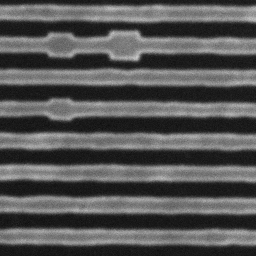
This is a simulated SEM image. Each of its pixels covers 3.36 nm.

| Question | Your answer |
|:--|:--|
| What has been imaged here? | wiring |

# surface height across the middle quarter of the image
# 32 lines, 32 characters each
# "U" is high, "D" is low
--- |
DDDDDDDDDDDDDDDDDDDDDDDDDDDDDDDD
DDDDDDDDDDDDDDDDDDDDDDDDDDDDDDDD
UUUUUUUUUUUUUUUUUUUUUUUUUUUUUUUU
UUUUUUUUUUUUUUUUUUUUUUUUUUUUUUUU
UUUUUUUUUUUUUUUUUUUUUUUUUUUUUUUU
DDDDDDDDDDDDDDDDDDDDDDDDDDDDDDDD
DDDDDDDDDDDDDDDDDDDDDDDDDDDDDDDD
DDDDDDDDDDDDDDDDDDDDDDDDDDDDDDDD
DDDDDDDDDDDDDDDDDDDDDDDDDDDDDDDD
UUDDDDDDDDDDDDDDDDDDDDDDDDDDDDDD
UUUUUUUUUUUUUUUUUUUUUUUUUUUUUUUU
UUUUUUUUUUUUUUUUUUUUUUUUUUUUUUUU
UUUUUUUUUUUUUUUUUUUUUUUUUUUUUUUU
UUDDDDDDDDDDDDDDDDDDDDDDDDDDDDDD
DDDDDDDDDDDDDDDDDDDDDDDDDDDDDDDD
DDDDDDDDDDDDDDDDDDDDDDDDDDDDDDDD
DDDDDDDDDDDDDDDDDDDDDDDDDDDDDDDD
DDDDDDDDDDDDDDDDDDDDDDDDDDDDDDDD
UUUUUUUUUUUUUUUUUUUUUUUUUUUUUUUU
UUUUUUUUUUUUUUUUUUUUUUUUUUUUUUUU
UUUUUUUUUUUUUUUUUUUUUUUUUUUUUUUU
DDDDDDDDDDDDDDDDDDDDDDDDDDDDDDDD
DDDDDDDDDDDDDDDDDDDDDDDDDDDDDDDD
DDDDDDDDDDDDDDDDDDDDDDDDDDDDDDDD
DDDDDDDDDDDDDDDDDDDDDDDDDDDDDDDD
DDDDDDDDDDDDDDDDDDDDDDDDDDDDDDDD
UUUUUUUUUUUUUUUUUUUUUUUUUUUUUUUU
UUUUUUUUUUUUUUUUUUUUUUUUUUUUUUUU
UUUUUUUUUUUUUUUUUUUUUUUUUUUUUUUU
DDDDDDDDDDDDDDDDDDDDDDDDDDDDDDDD
DDDDDDDDDDDDDDDDDDDDDDDDDDDDDDDD
DDDDDDDDDDDDDDDDDDDDDDDDDDDDDDDD